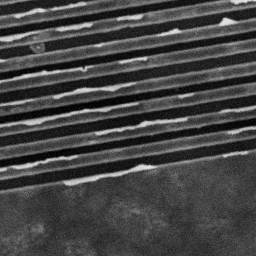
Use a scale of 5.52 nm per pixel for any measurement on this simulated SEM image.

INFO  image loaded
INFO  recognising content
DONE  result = parallel lines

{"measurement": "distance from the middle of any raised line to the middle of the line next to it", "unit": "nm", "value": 118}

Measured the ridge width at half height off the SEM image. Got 0.0675 um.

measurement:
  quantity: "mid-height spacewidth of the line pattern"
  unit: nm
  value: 52.1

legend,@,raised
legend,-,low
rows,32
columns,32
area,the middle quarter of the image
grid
------@@@@@@@@@@@@@@@@@---------
@@@@@@@@@@@@@@@@@---------------
@@@@@@@@@@@--------------------@
@@@@@@-------------------@@@@@@@
-------------------@@@@@@@@@@@@@
-----------@@@@@@@@@@@@@@@@@@---
---@@@@@@@@@@@@@@@@@@@@---------
@@@@@@@@@@@@@@@@@--------------@
@@@@@@@@@@@--------------@@@@@@@
@@@@@--------------@@@@@@@@@@@@@
-------------@@@@@@@@@@@@@@@@---
-----@@@@@@@@@@@@@@@@@@@--------
@@@@@@@@@@@@@@@@@---------------
@@@@@@@@@@@@-----------------@@@
@@@@@@--------------@@@@@@@@@@@@
------------------@@@@@@@@@@@@@@
-----------@@@@@@@@@@@@@@@@@@---
-----@@@@@@@@@@@@@@@@@----------
@@@@@@@@@@@@@@@@-------------@@@
@@@@@@@@@@-------------@@@@@@@@@
@@@@-------------@@@@@@@@@@@@@@@
-----------@@@@@@@@@@@@@@@@@----
-----@@@@@@@@@@@@@@@@@@---------
@@@@@@@@@@@@@@@@----------------
@@@@@@@@@@@------------------@@@
@@@@@-------------@@@@-@@@@@@@@@
----------------@@@@@@@@@@@@@@@@
-----------@@@@@@@@@@@@@@@@@@@@@
-----@@@@@@@@@@@@@@@@@@@@@@@@@@@
@@@@@@@@@@@@@@@@@@@@@@@@@@@@@@@@
@@@@@@@@@@@@@@@@@@@@@@@@@@@@@@@@
@@@@@@@@@@@@@@@@@@@@@@@@@@@@@@@@